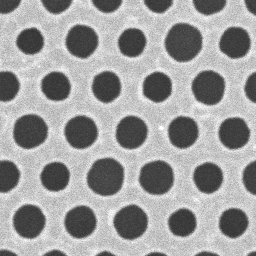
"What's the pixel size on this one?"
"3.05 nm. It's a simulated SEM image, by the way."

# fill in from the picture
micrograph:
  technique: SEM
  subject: a regular array of holes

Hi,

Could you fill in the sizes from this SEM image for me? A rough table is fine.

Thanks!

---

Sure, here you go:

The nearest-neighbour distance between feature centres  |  51 px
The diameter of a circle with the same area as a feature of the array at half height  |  98.9 nm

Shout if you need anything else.